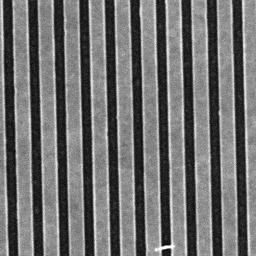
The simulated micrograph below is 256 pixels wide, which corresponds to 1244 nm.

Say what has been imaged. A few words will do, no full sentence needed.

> parallel lines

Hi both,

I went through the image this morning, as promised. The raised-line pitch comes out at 124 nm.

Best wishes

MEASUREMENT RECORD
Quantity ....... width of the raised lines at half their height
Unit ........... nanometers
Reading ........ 69.8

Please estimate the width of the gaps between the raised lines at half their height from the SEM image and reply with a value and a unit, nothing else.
0.0559 µm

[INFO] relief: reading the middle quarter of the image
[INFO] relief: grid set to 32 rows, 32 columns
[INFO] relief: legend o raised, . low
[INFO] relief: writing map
.ooo...ooo...oooo...ooo...ooo...
.ooo...ooo...oooo...ooo...ooo...
oooo...ooo...oooo...ooo...ooo...
oooo...ooo...oooo...ooo...ooo...
oooo...ooo...oooo...ooo...ooo...
oooo...ooo...oooo...ooo...oooo..
.ooo...ooo...oooo...ooo...oooo..
.ooo...ooo...oooo...ooo...oooo..
.ooo...ooo....ooo...ooo...oooo..
.ooo...ooo....ooo...ooo...oooo..
.ooo...ooo....ooo...ooo...oooo..
.ooo...ooo....ooo...ooo...oooo..
.ooo...ooo....ooo...ooo...oooo..
.ooo...oooo..oooo...ooo...oooo..
.ooo...oooo...ooo...ooo...oooo..
.ooo...oooo...ooo...oooo..oooo..
.ooo...oooo...ooo...oooo..oooo..
.ooo...oooo...ooo...oooo..oooo..
.ooo...oooo...ooo...oooo..oooo..
.ooo...oooo...ooo...oooo..oooo..
.ooo...oooo...ooo...oooo..oooo..
.ooo...oooo...ooo...oooo...ooo..
.ooo...oooo...ooo...oooo...ooo..
.oooo..oooo...ooo...oooo...ooo..
.oooo..oooo...ooo...oooo...ooo..
.oooo..oooo...ooo...oooo...ooo..
.ooo...oooo...ooo...oooo...ooo..
.ooo...oooo...ooo...oooo...ooo..
.ooo...oooo...ooo...oooo...ooo..
.oooo...ooo...ooo...oooo...ooo..
.oooo...ooo...ooo...oooo...ooo..
.oooo...ooo...ooo...oooo...ooo..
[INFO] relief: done